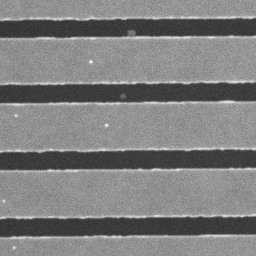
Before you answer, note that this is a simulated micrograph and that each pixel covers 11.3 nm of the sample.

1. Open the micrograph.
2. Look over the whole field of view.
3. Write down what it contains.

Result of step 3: lines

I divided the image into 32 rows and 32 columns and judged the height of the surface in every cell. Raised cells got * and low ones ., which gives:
********************************
********************************
*...............................
................................
................................
********************************
********************************
********************************
********************************
********************************
********........................
................................
................................
********************************
********************************
********************************
********************************
********************************
********************************
................................
................................
********************************
********************************
********************************
********************************
********************************
********************************
................................
................................
....................*....*******
********************************
********************************